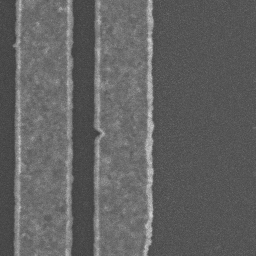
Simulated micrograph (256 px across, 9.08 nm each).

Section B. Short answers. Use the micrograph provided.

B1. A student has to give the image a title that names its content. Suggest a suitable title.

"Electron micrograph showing one or a few lines or trenches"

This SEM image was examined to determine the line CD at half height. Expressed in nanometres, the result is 488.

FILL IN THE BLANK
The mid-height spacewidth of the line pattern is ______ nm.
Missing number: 238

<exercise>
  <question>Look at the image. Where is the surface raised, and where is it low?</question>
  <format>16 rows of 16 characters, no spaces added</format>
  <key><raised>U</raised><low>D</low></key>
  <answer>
DUUUDDUUUDDDDDDD
DUUUDDUUUDDDDDDD
DUUUDDUUUDDDDDDD
DUUUDDUUUDDDDDDD
DUUUDDUUUDDDDDDD
DUUUDDUUUDDDDDDD
DUUUDDUUUDDDDDDD
DUUUDDUUUDDDDDDD
DUUUDDUUUDDDDDDD
DUUUDDUUUDDDDDDD
DUUUDDUUUDDDDDDD
DUUUDDUUUDDDDDDD
DUUUDDUUUDDDDDDD
DUUUDDUUUDDDDDDD
DUUUDDUUUDDDDDDD
DUUUDDUUUDDDDDDD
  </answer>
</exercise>